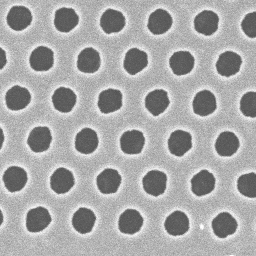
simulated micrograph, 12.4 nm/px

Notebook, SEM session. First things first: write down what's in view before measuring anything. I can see a regular array of holes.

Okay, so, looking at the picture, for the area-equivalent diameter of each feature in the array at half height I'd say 0.323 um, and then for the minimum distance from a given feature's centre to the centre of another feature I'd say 572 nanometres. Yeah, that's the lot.